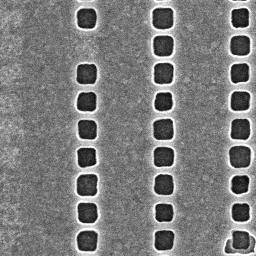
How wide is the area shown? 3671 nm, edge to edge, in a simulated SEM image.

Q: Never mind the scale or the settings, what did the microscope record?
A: a regular array of holes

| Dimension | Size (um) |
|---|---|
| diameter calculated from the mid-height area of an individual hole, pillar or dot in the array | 0.317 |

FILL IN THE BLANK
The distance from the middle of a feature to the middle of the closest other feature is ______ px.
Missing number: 27.7